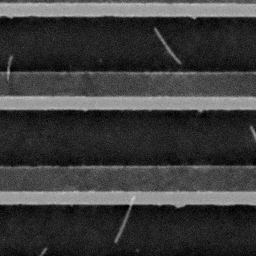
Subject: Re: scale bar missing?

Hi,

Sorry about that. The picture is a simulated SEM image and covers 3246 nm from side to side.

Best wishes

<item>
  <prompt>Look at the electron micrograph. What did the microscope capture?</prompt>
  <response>lines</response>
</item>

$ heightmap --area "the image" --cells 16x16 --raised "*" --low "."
****************
................
................
................
*...............
****************
****************
................
................
................
****************
****************
****************
................
................
................